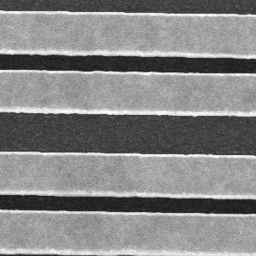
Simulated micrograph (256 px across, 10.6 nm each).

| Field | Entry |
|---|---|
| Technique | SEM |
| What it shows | lines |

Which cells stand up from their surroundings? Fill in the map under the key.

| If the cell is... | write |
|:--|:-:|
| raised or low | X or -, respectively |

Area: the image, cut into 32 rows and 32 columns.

--------------------------------
XXXXXXXXX-----------------------
XXXXXXXXXXXXXXXXXXXXXXXXXXXXXXXX
XXXXXXXXXXXXXXXXXXXXXXXXXXXXXXXX
XXXXXXXXXXXXXXXXXXXXXXXXXXXXXXXX
XXXXXXXXXXXXXXXXXXXXXXXXXXXXXXXX
XXXXXXXXXXXXXXXXXXXXXXXXXXXXXXXX
--------------------------------
--------------------------------
XXXXXXXXXXXXXXXXXXXXXXXXXXXXXXXX
XXXXXXXXXXXXXXXXXXXXXXXXXXXXXXXX
XXXXXXXXXXXXXXXXXXXXXXXXXXXXXXXX
XXXXXXXXXXXXXXXXXXXXXXXXXXXXXXXX
XXXXXXXXXXXXXXXXXXXXXXXXXXXXXXXX
--------------------------------
--------------------------------
--------------------------------
--------------------------------
--------------------------------
XXXXXXXXXXXXXXXXXXXXXXXXXXXXXXXX
XXXXXXXXXXXXXXXXXXXXXXXXXXXXXXXX
XXXXXXXXXXXXXXXXXXXXXXXXXXXXXXXX
XXXXXXXXXXXXXXXXXXXXXXXXXXXXXXXX
XXXXXXXXXXXXXXXXXXXXXXXXXXXXXXXX
-------XX-XXXXXXXXXXXXXXXXXXXXXX
--------------------------------
XXXXXXXXXXXXXX------------------
XXXXXXXXXXXXXXXXXXXXXXXXXXXXXXXX
XXXXXXXXXXXXXXXXXXXXXXXXXXXXXXXX
XXXXXXXXXXXXXXXXXXXXXXXXXXXXXXXX
XXXXXXXXXXXXXXXXXXXXXXXXXXXXXXXX
XXXXXXXXXXXXXXXXXXXXXXXXXXXXXXXX